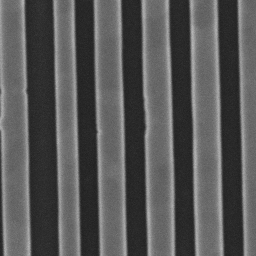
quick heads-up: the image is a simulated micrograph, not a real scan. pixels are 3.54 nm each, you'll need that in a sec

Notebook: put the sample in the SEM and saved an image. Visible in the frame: parallel lines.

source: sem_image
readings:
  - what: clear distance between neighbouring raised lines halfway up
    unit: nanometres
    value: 77.9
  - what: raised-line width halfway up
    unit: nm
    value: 90.3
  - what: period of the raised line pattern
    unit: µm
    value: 0.168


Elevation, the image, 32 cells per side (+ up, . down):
+++....++...+++...+++...+++...++
+++....++...+++...+++...+++...++
+++....++...+++...+++...+++...++
+++....++...+++...+++...+++...++
+++....++...+++...+++...+++...++
+++....++...+++...+++...+++...++
+++....++...+++...+++...+++...++
+++....++...+++...+++...+++...++
+++....++...+++...+++...+++...++
+++....++...+++...+++...+++...++
+++....++...+++...+++...+++...++
+++....++...+++...+++...+++...++
+++....++...+++...+++...+++...++
+++....++...+++...+++...+++...++
+++....++...+++...+++...+++...++
+++....++...+++...+++...+++...++
+++....+++..+++...+++...+++...++
+++....+++..+++...+++...+++...++
+++....+++..+++...++++..+++...++
++++...+++..+++...++++..+++...++
++++...+++..++++..++++..+++...++
+++....+++..++++..++++..++++..++
+++....+++..+++...++++..++++..++
+++....+++...++...++++..++++..++
++++...+++...++...++++..++++..++
++++...+++...+++..++++..++++..++
++++...+++...+++...+++..++++..++
.+++...+++...+++...+++..++++...+
.+++...+++...+++...+++..++++...+
.+++...+++...+++...+++...+++...+
.+++...+++...+++...+++...+++...+
.+++....++...+++...+++...+++...+